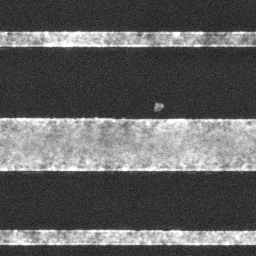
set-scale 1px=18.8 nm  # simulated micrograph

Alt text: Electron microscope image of lines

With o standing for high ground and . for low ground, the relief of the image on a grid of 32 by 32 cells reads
................................
................................
................................
................................
oooooooooooooooooooooooooooooooo
oooooooooooooooooooooooooooooooo
................................
................................
................................
................................
................................
................................
................................
................................
................................
oooooooooooooooooooooooooooooooo
oooooooooooooooooooooooooooooooo
oooooooooooooooooooooooooooooooo
oooooooooooooooooooooooooooooooo
oooooooooooooooooooooooooooooooo
oooooooooooooooooooooooooooooooo
................................
................................
................................
................................
................................
................................
................................
................................
oooooooooooooooooooooooooooooooo
oooooooooooooooooooooooooooooooo
................................